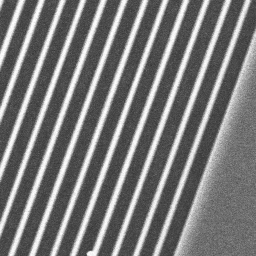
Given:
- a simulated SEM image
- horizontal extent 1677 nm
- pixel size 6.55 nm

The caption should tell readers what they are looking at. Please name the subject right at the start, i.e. parallel lines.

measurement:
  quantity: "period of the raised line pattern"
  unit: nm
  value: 127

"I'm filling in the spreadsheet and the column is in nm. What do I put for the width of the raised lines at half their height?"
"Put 30.9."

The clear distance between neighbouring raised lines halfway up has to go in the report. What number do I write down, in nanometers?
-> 93.2